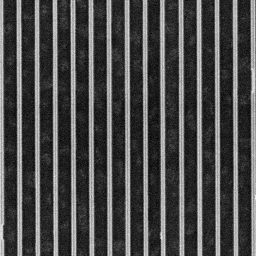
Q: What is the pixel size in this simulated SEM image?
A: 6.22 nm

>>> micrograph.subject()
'parallel lines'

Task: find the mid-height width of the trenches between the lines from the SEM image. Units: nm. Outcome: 87.9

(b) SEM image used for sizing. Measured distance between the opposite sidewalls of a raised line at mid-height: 24.1 nm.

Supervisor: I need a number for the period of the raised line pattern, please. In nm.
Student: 112